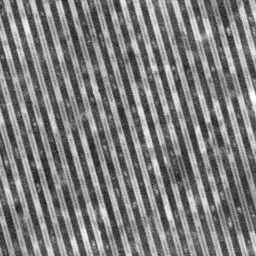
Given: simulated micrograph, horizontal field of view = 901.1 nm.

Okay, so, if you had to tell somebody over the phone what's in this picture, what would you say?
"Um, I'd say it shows parallel lines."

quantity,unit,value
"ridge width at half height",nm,17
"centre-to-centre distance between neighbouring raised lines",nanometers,43.9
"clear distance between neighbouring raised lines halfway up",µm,0.0271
